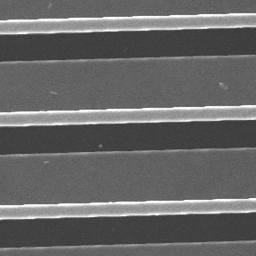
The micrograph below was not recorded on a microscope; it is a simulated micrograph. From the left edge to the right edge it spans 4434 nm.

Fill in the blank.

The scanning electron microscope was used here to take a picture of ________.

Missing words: lines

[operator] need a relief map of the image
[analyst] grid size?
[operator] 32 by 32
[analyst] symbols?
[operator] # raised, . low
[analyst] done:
################################
################################
################################
###########################.....
................................
................................
................................
.........#######################
################################
################################
################################
################################
################################
################################
################################
#########.......................
................................
................................
................................
################################
################################
################################
################################
################################
################################
################################
################################
................................
................................
................................
....................############
################################